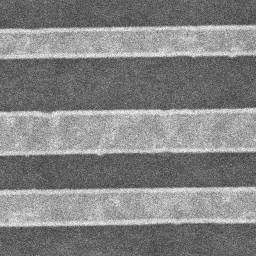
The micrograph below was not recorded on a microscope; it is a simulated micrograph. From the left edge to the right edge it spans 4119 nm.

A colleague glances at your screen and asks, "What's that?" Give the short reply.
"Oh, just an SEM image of one or a few lines or trenches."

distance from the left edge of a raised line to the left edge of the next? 1.32 microns